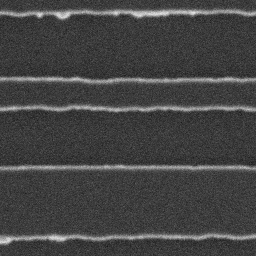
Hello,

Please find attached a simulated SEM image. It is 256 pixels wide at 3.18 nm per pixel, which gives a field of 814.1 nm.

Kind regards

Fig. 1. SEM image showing lines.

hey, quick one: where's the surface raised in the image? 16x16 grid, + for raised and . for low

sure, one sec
++++++++++++++++
................
................
................
................
++++++++++++++++
++++++++++++++++
................
................
................
++++++++++++++++
++++++++++++++++
++++++++++++++++
++++++++++++++++
++++++++++++++++
................